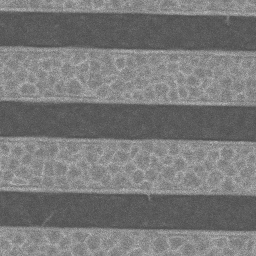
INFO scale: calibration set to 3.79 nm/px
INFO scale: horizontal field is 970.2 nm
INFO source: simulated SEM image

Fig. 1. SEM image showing one or a few lines or trenches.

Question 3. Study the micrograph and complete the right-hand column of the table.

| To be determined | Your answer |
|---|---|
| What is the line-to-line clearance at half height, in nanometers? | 140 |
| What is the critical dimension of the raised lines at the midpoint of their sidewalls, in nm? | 198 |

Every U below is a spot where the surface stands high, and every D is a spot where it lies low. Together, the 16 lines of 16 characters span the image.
UUUUUUUUUUUUUUUU
DDDDDDDDDDDDDDDD
DDDDDDDDDDDDDDDD
UUUUUUUUUUUUUUUU
UUUUUUUUUUUUUUUU
UUUUUUUUUUUUUUUU
DDDDDDDDDDDDUUUU
DDDDDDDDDDDDDDDD
DDDDDDDDDDDDDDDD
UUUUUUUUUUUUUUUU
UUUUUUUUUUUUUUUU
UUUUUUUUUUUUUUUU
DDDDDDDDDDDDDDDD
DDDDDDDDDDDDDDDD
UUUUUUUUUUUUUDDD
UUUUUUUUUUUUUUUU